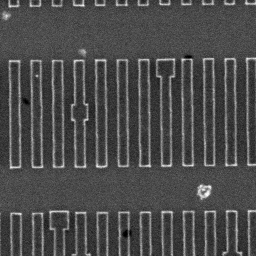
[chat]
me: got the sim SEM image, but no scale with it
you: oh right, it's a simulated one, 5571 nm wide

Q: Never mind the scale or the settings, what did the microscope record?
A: wiring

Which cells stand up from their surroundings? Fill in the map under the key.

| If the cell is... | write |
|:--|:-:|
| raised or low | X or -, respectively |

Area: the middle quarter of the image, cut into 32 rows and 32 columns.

---XX---XX---XXX---XX--XXXXX--XX
---XX---XX---XXX---XX--XXXXX--XX
---XX---XX---XXX---XX--XXXXX--XX
---XX---XX---XXX---XX---XXX---XX
---XX---XX---XXX---XX---XX----XX
---XX---XXX---XX---XX---XX----XX
---XX---XXX---XX---XX---XX----XX
---XX---XXX---XX---XX---XX----XX
---XX---XXX---XX---XX---XXX---XX
---XX---XXX---XX---XX---XXX---XX
--XXXX--XXX---XX---XX---XXX---XX
--XXXX--XXX---XX---XX---XXX---XX
--XXXX--XXX---XX---XX---XXX---XX
--XXXX--XXX---XX---XX---XXX---XX
---XX---XXX---XX---XX---XXX---XX
---XX---XXX---XX---XX---XXX---XX
---XX---XXX---XX---XX---XXX---XX
---XX---XXX---XX---XX---XXX---XX
---XX---XXX---XX---XX---XXX---XX
---XX---XXX---XX---XX---XXX---XX
---XX---XXX---XX---XX---XXX---XX
---XX---XXX---XX---XX---XXX---XX
---XX---XXX---XX---XX---XXX---XX
---XX---XXX---XX---XX----XX---XX
---XX---XXX---XX---XX----XX---XX
---XX---XXX---XX---XX----X------
--------------------------------
--------------------------------
--------------------------------
--------------------------------
--------------------------------
--------------------------------